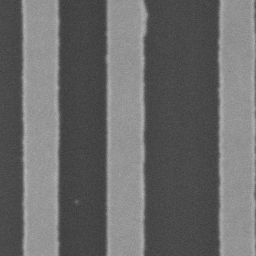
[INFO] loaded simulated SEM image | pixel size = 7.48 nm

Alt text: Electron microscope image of lines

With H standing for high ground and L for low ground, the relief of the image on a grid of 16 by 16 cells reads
LHHHLLLHHLLLLLHH
LHHHLLLHHLLLLLHH
LLHHLLLHHLLLLLHH
LHHHLLLHHLLLLLHH
LHHHLLLHHLLLLLHH
LHHHLLLHHLLLLLHH
LHHHLLLHHLLLLLHH
LLHHLLLHHLLLLLHH
LLHHLLLHHLLLLLHH
LHHHLLLHHLLLLLHH
LLHHLLLHHLLLLLHH
LLHHLLLHHLLLLLHH
LLHHLLLHHLLLLLHH
LLHHLLLHHLLLLLHH
LLHHLLLHHLLLLLHH
LLHHLLLHHLLLLLHH